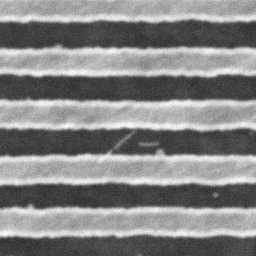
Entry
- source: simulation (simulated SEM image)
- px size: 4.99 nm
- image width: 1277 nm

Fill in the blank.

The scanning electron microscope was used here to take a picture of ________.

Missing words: lines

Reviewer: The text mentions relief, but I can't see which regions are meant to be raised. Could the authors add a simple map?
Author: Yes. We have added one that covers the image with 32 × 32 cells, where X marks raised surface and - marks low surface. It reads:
XXXXXXXXXXXXXXXXXXXXXXXXXXXXXXXX
XXXXXXXXXXXXXXXXXXXXXXXXXXXXXXXX
XXXX-XXXXXXX--XXXXXXXX----XXXXX-
--------------------------------
--------------------------------
--------------------------------
XXXXXXXXXXXXXXXXXXXXXXXXXXXXXXXX
XXXXXXXXXXXXXXXXXXXXXXXXXXXXXXXX
XXXXXXXXXXXXXXXXXXXXXXXXXXXXXXXX
--------------------------X-----
--------------------------------
--------------------------------
--------------------------------
XXXXXXXXXXXXXXXXXXXXXXXXXXXXXXXX
XXXXXXXXXXXXXXXXXXXXXXXXXXXXXXXX
XXXXXXXXXXXXXXXXXXXXXXXXXXXXXXXX
--------------------------------
--------------------------------
--------------------------------
----------XX-X---------X--------
XXXXXXXXXXXXXXXXXXXXXXXXXXXXXXXX
XXXXXXXXXXXXXXXXXXXXXXXXXXXXXXXX
XXXXXXXXXXXXXXXXXXXXXXXXXXXXXXXX
--------------------------------
--------------------------------
--------------------------------
XXXXXXXXXXXXXXXXXXXXXXXXXXXXXXXX
XXXXXXXXXXXXXXXXXXXXXXXXXXXXXXXX
XXXXXXXXXXXXXXXXXXXXXXXXXXXXXXXX
---XX-X-----------------XX----X-
--------------------------------
--------------------------------